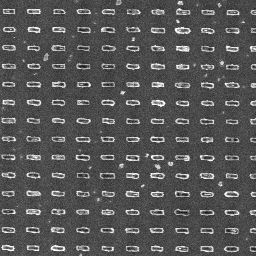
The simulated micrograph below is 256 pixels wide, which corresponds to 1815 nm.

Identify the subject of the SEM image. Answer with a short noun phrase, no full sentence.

a regular array of raised bodies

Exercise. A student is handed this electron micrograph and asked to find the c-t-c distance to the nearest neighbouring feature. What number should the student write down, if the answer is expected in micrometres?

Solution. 0.128